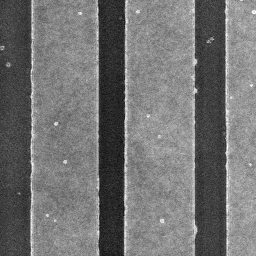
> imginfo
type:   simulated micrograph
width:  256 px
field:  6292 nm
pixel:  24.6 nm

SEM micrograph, lines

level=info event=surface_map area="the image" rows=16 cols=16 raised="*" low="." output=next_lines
..****..****..**
..****..****..**
..****..****..**
..****..****..**
..****..****..**
..****..****..**
..****..****..**
..****..****..**
..****..****..**
..****..****..**
..****..****..**
..****..****..**
..****..****..**
..****..****..**
..****..****..**
..****..****..**